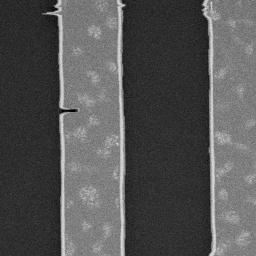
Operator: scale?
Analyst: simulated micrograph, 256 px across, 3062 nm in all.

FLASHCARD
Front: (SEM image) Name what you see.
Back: one or a few lines or trenches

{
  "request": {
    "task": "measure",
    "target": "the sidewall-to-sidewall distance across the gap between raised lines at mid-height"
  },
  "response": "1090 nanometers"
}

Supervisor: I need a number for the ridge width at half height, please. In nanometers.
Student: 704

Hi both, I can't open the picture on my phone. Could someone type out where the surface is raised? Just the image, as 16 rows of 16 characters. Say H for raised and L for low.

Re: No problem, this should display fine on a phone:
LLLLHHHLLLLLLHHH
LLLLHHHLLLLLLHHH
LLLLHHHLLLLLLHHH
LLLLHHHLLLLLLHHH
LLLLHHHLLLLLLHHH
LLLLHHHHLLLLLHHH
LLLLHHHHLLLLLHHH
LLLLHHHHLLLLLHHH
LLLLHHHHLLLLLHHH
LLLLHHHHLLLLLHHH
LLLLHHHHLLLLLHHH
LLLLHHHHLLLLLHHH
LLLLHHHHLLLLLHHH
LLLLHHHHLLLLLHHH
LLLLHHHHLLLLLHHH
LLLLHHHHLLLLLHHH